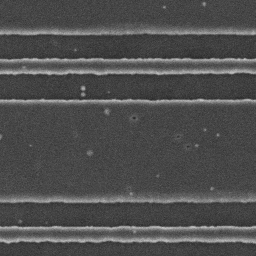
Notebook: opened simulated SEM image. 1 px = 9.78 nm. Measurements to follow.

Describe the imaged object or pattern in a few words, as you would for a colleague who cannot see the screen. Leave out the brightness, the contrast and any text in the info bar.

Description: lines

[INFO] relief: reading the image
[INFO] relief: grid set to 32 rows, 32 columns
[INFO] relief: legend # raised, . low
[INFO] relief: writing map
################################
################################
################################
################################
................................
................................
................................
################################
################################
................................
................................
................................
.....#........#.##......##....##
################################
################################
################################
################################
################################
################################
################################
################################
################################
################################
################################
################################
................................
................................
................................
################################
################################
................................
................................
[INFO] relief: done